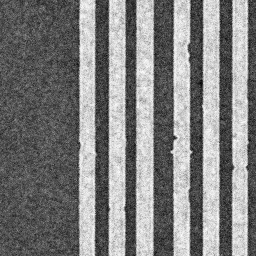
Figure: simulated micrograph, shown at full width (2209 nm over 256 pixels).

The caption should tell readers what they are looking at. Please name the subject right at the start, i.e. parallel lines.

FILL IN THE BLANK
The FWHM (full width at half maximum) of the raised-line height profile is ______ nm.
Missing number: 122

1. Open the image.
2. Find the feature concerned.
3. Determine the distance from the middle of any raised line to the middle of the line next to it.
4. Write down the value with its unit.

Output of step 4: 264 nm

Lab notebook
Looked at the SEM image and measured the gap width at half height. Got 131 nanometers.